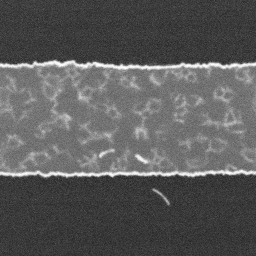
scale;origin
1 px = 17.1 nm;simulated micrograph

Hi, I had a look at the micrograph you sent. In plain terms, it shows one or a few lines or trenches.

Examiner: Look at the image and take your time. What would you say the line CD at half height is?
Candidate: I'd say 1840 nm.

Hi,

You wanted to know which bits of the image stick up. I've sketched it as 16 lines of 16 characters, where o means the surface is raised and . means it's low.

................
................
................
................
oooooooooooooooo
oooooooooooooooo
oooooooooooooooo
oooooooooooooooo
oooooooooooooooo
oooooooooooooooo
oooooooooooooooo
................
................
................
................
................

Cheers